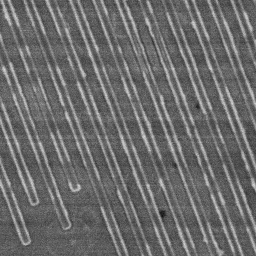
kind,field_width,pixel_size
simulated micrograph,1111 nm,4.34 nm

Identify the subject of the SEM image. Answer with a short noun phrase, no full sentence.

parallel lines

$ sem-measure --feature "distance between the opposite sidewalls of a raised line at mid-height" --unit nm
40.6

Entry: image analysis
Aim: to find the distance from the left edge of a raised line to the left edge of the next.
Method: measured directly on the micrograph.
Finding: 0.0937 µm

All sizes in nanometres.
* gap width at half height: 52.9